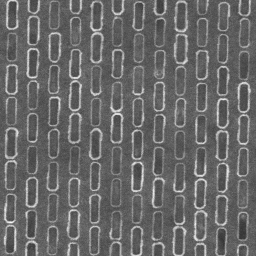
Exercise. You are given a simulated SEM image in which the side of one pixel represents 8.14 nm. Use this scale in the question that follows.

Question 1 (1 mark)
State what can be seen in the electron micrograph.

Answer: a regular array of holes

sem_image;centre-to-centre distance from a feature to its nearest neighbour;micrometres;0.213